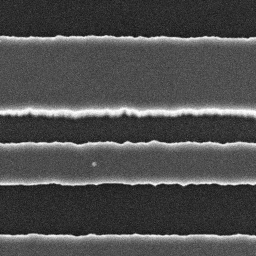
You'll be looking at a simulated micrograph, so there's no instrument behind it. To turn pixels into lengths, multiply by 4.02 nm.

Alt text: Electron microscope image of lines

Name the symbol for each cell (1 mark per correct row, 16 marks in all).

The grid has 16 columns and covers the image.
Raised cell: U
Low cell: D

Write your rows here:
DDDDDDDDDDDDDDDD
DDDDDDDDDDDDDDDD
UUUUUUUUUUUUUUUU
UUUUUUUUUUUUUUUU
UUUUUUUUUUUUUUUU
UUUUUUUUUUUUUUUU
UUUUUUUUUUUUUUUU
DDDDDDDDDDDDDDDD
DDDDDDDDDDDDDDDD
UUUUUUUUUUUUUUUU
UUUUUUUUUUUUUUUU
UUDDUUDDDDDDDDUD
DDDDDDDDDDDDDDDD
DDDDDDDDDDDDDDDD
DDDDDDDDDDDDDDDD
UUUUUUUUUUUUUUUU